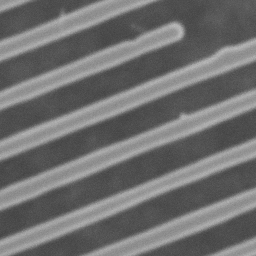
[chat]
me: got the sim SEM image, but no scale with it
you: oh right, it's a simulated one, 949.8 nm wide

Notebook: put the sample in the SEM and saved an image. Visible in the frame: parallel lines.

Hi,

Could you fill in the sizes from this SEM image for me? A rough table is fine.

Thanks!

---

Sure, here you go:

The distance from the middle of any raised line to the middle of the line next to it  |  0.171 microns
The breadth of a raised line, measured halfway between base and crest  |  63 nm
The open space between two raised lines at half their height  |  0.107 µm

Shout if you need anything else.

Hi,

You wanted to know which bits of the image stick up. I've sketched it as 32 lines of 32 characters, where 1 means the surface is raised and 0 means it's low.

11100000000011111100000000000000
00000000011111100000000000000000
00000001111110000000000000000000
00000111111000000000111000000000
00111111000000000011111000000000
11111100000000011111100000000001
11100000000001111100000000011111
00000000001111110000000000111111
00000000111110000000000111111000
00000111111000000000111111000000
00111111000000000011111100000000
11111100000000001111100000000001
11100000000001111110000000000111
00000000000111111000000000111111
00000000111111000000000111111000
00000011111000000000011111100000
00011111100000000011111100000000
01111100000000001111110000000000
11110000000001111110000000000111
10000000000111110000000000011111
00000000111111000000000011111000
00000011111100000000001111100000
00011111100000000001111100000000
01111110000000000111110000000000
11111000000000111110000000000011
11000000000011111000000000011111
00000000011111100000000011111100
00000001111100000000001111110000
00001111110000000000111111000000
00111110000000000111111000000000
11111000000000111111100000000011
11000000000011111100000000011111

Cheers